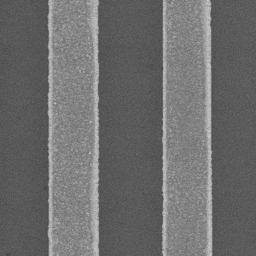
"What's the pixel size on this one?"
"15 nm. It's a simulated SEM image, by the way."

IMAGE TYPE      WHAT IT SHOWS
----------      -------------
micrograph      lines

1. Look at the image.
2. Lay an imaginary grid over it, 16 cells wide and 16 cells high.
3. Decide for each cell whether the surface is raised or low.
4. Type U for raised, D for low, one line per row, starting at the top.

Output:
DDDUUUDDDDUUUDDD
DDDUUUDDDDUUUDDD
DDDUUUDDDDUUUDDD
DDDUUUDDDDUUUDDD
DDDUUUDDDDUUUDDD
DDDUUUDDDDUUUDDD
DDDUUUDDDDUUUDDD
DDDUUUDDDDUUUDDD
DDDUUUDDDDUUUDDD
DDDUUUDDDDUUUDDD
DDDUUUDDDDUUUDDD
DDDUUUDDDDUUUDDD
DDDUUUDDDDUUUDDD
DDDUUUDDDDUUUDDD
DDDUUUDDDDUUUDDD
DDDUUUDDDDUUUDDD